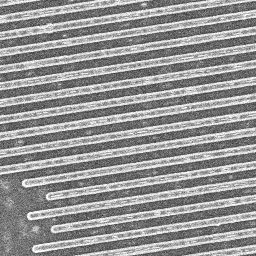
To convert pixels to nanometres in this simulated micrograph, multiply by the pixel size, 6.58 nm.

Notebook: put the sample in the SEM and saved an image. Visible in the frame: parallel lines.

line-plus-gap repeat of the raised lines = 109 nm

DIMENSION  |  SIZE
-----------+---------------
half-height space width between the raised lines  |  69.9 nm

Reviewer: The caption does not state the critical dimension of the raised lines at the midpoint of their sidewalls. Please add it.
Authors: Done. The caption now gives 38.2 nm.